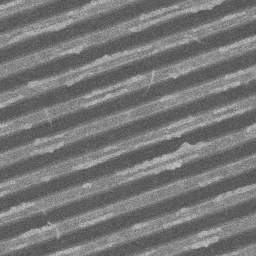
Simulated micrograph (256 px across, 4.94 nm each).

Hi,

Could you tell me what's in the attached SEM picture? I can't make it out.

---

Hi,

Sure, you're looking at parallel lines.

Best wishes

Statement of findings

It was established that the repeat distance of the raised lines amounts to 138 nm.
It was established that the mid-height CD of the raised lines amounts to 66.5 nm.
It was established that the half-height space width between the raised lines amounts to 75.3 nm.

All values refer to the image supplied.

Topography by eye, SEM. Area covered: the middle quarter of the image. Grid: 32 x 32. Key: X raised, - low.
----XXXXXXXXXX------------XXXXXX
-XXXXXXXXXX------------XXXXXXXXX
XXXXXXXX------------XXXXXXXXXX--
XXXXX------------XXXXXXXXXX-----
XXX-----------XXXXXXXXXX--------
-----------XXXXXXXXXXX----------
--------XXXXXXXXXX------------XX
-----XXXXXXXXXX------------XXXXX
---XXXXXXXXX------------XXXXXXXX
XXXXXXXXX-------------XXXXXXXXX-
XXXXXX-------------XXXXXXXXX----
XXXX------------XXXXXXXXX-------
X------------XXXXXXXXX----------
----------XXXXXXXXX------------X
-------XXXXXXXXX------------XXXX
----XXXXXXXXX------------XXXXXXX
-XXXXXXXXX------------XXXXXXXXXX
XXXXXXXX------------XXXXXXXXXX--
XXXXX------------XXXXXXXXXX-----
XX------------XXXXXXXXX---------
-----------XXXXXXXXX---------XXX
--------XXXXXXXXXX----------XXXX
------XXXXXXXXX-----------XXXXXX
---XXXXXXXXX-----------XXXXXXXXX
XXXXXXXXXX----------XXXXXXXXXXX-
XXXXXXX-----------XXXXXXXXXXX---
XXXX-----------XXXXXXXXXX-------
X-----------XXXXXXXXXX----------
----------XXXXXXXXX------------X
-------XXXXXXXXX-----------XXXXX
----XXXXXXXXX------------XXXXXXX
-XXXXXXXXXX-----------XXXXXXXXXX